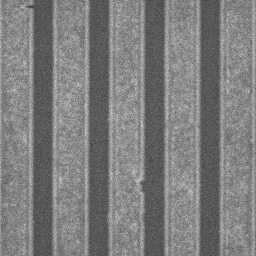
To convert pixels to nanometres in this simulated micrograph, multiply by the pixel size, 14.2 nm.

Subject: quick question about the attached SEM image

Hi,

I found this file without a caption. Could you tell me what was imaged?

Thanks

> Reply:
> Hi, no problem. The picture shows parallel lines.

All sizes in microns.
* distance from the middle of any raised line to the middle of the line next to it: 0.789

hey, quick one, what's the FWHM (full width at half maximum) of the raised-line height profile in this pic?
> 457 nm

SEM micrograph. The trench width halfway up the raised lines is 0.331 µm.